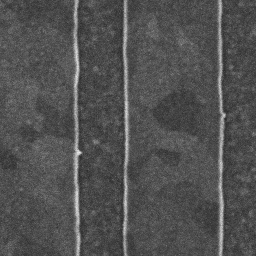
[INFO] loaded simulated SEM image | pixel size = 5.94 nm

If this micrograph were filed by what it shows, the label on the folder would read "one or a few lines or trenches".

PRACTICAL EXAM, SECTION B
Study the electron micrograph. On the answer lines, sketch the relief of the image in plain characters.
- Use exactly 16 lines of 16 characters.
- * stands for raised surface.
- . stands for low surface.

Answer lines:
*****...******..
*****...******..
*****...******..
*****...******..
*****...******..
*****...******..
*****...******..
*****...******..
*****...******..
*****...******..
*****...******..
*****...******..
*****...******..
*****...******..
*****...******..
*****...******..